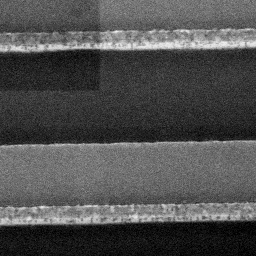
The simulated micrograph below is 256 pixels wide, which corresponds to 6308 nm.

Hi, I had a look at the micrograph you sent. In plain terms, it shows lines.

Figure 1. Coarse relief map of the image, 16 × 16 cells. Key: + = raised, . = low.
++++++++++++++++
++++++++++++++++
++++++++++++++++
................
................
................
................
................
................
++++++++++++++++
++++++++++++++++
++++++++++++++++
++++++++++++++++
++++++++++++++++
................
................